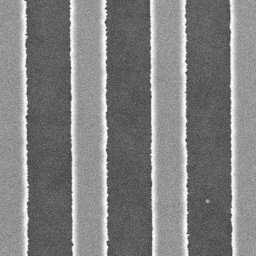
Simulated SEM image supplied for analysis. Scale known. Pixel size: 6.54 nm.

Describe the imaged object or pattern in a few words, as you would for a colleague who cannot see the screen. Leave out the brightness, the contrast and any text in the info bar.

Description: lines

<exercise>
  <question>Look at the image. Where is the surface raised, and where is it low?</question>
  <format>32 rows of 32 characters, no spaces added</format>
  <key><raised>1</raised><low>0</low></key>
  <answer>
11100000011110000001111000000111
11100000011110000001111000000111
11100000011110000001111000000111
11100000011110000001111000000111
11100000011110000001111000000111
11100000011110000001111000000111
11100000011110000001111000000111
11100000011110000001111000000111
11100000011110000001111000000111
11100000011110000001111000000111
11100000011110000001111000000111
11100000011110000001111000000111
11100000011110000001111000000111
11100000011110000001111000000111
11100000011110000001111000000111
11100000011110000001111000000111
11100000011110000001111000000111
11100000011110000001111000000111
11100000011110000001111000000111
11100000011110000001111000000111
11100000011110000001111000000111
11100000011110000001111000000111
11100000011110000001111000000111
11100000011110000001111000000111
11100000011110000001111000000111
11100000011110000001111000000111
11100000011110000001111000000111
11100000011110000001111000000111
11100000011110000001111000000111
11100000011110000001111000000111
11100000011110000001111000000111
11100000011110000001111000000111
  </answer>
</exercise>